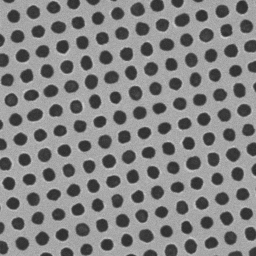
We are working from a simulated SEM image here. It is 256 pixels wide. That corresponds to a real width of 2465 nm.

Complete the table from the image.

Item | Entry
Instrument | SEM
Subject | a regular array of holes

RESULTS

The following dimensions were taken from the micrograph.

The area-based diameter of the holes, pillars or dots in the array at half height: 0.13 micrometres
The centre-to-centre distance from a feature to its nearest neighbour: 192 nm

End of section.